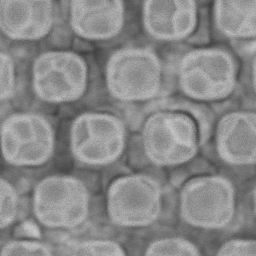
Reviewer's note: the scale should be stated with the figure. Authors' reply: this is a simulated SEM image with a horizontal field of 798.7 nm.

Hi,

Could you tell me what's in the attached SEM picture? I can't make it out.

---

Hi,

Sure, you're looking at a regular array of raised bodies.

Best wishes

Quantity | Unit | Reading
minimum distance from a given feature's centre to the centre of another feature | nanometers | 228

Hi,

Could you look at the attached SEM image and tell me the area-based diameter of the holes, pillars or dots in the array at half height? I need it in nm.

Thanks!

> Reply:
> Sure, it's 167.